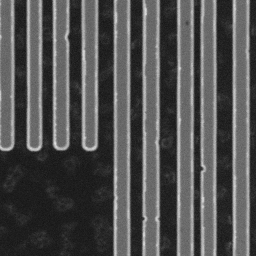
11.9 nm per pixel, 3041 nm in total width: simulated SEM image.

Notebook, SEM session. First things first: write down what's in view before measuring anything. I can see parallel lines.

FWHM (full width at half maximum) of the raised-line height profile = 169 nanometres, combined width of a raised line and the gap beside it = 0.352 microns